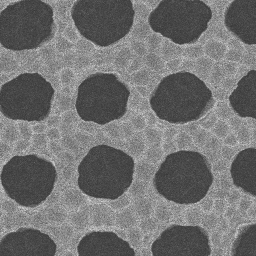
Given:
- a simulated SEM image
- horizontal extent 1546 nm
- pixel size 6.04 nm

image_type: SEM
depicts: holes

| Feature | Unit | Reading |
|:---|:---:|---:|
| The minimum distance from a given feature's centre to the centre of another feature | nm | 462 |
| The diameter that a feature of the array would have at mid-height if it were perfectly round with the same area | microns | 0.331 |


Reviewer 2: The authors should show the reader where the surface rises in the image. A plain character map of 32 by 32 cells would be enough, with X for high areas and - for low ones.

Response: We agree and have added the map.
XX----XXX-------XXXX------XXX---
-------XX--------XX-------XX----
-------XX--------XX-------XX----
------XXXX------XXX-------XXX---
------XXXX------XXXX-----XXXXX--
-----XXXXXXX--XXXXXXXX-XXXXXXXX-
XXXXXXXXXXXXXXXXXXXXXXXXXXXXXXXX
XXXXXXXXXXXXXXXXXXXXXXXXXXXXXXXX
XXXXXXXXXXXXXXXXXXXXXXXXXXXXXXXX
XX---XXXXXX---XXXXXXX---XXXXXXX-
X-----XXXX-----XXXXX------XXXX--
-------XXX------XXX-------XXX---
------XXXX------XXX-------XXX---
------XXXX------XXX-------XXX---
X-----XXXX-----XXXXX-----XXXXX--
XXXXXXXXXXXXXXXXXXXXXXXXXXXXXXXX
XXXXXXXXXXXXXXXXXXXXXXXXXXXXXXXX
XXXXXXXXXXXXXXXXXXXXXXXXXXXXXXXX
XXXXXXXXXXXX--XXXXXXXXXXXXXXXXXX
XX--XXXXXXX-----XXXXX----XXXXX--
X-----XXXX-------XXX------XXX---
-------XXX-------XXX------XXX---
-------XXX-------XX--------XX---
-------XXX------XXX-------XXXX--
X-----XXXXX----XXXXX------XXXXXX
XX---XXXXXXXXXXXXXXXXXXXXXXXXXXX
XXXXXXXXXXXXXXXXXXXXXXXXXXXXXXXX
XXXXXXXXXXXXXXXXXXXXXXXXXXXXXXXX
XXX-XXXXXXXXXXXXXXXXX----XXXXXX-
X-----XXXXX----XXXXX------XXXX--
-------XXX------XXX-------XXX---
-------XXX-------XX-------XXX---